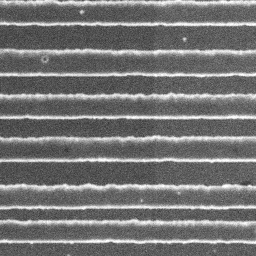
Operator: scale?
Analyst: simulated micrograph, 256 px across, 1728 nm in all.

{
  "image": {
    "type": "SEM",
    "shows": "lines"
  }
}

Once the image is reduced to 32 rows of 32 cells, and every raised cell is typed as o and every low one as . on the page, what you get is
oooooooooooooooooooooooooooooooo
oooooooooooooooooooooooooooooooo
oooooooooooooooooooooooooooooooo
................................
................................
................................
ooooooo.oooooo.oo..oooooo.ooo..o
oooooooooooooooooooooooooooooooo
oooooooooooooooooooooooooooooooo
.........................o......
................................
................................
oooooooooooooooooooooooooooooooo
oooooooooooooooooooooooooooooooo
oooooooooooooooooooooooooooooooo
................................
................................
oooooooooo.ooooooooooooooooooooo
oooooooooooooooooooooooooooooooo
oooooooooooooooooooooooooooooooo
................................
................................
................................
oooooooooooooooooooooooooooooooo
oooooooooooooooooooooooooooooooo
oooooooooooooooooooooooooooooooo
................................
................................
oooooooooooooooooooooooooooooooo
oooooooooooooooooooooooooooooooo
................................
................................